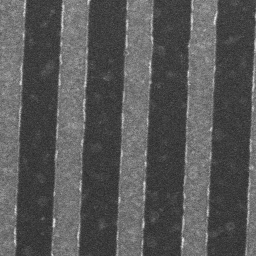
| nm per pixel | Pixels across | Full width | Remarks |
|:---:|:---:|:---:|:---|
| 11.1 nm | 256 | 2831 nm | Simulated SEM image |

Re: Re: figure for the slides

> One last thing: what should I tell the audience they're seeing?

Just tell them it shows one or a few lines or trenches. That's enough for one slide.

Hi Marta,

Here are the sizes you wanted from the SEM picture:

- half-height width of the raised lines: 446 nm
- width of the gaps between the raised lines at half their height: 0.267 micrometres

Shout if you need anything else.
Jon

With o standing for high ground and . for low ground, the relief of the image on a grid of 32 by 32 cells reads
...ooooo...ooooo...ooooo...ooooo
...ooooo...ooooo...ooooo...ooooo
...ooooo...ooooo...ooooo...ooooo
...ooooo...ooooo...ooooo...ooooo
...ooooo...ooooo...ooooo...ooooo
...ooooo...ooooo...ooooo...ooooo
...ooooo...ooooo...ooooo...ooooo
...ooooo...ooooo...ooooo...ooooo
...ooooo...ooooo...ooooo...ooooo
...oooo....ooooo...ooooo...ooooo
...oooo....ooooo...ooooo...ooooo
...oooo....ooooo...ooooo...ooooo
...oooo....ooooo...ooooo...ooooo
..ooooo...ooooo....ooooo..oooooo
..ooooo...oooooo..oooooo..oooooo
..ooooo...ooooo...ooooo...oooooo
..ooooo...ooooo...ooooo...oooooo
..ooooo...ooooo...ooooo...ooooo.
..ooooo...ooooo...ooooo...ooooo.
..ooooo...ooooo...ooooo...ooooo.
..ooooo...ooooo...ooooo...ooooo.
..ooooo...ooooo...ooooo...ooooo.
..ooooo...ooooo...ooooo...ooooo.
..ooooo...ooooo...ooooo...ooooo.
..ooooo...ooooo...ooooo...ooooo.
..ooooo...ooooo...ooooo...ooooo.
..ooooo...ooooo...ooooo...ooooo.
..ooooo...ooooo...ooooo...ooooo.
..ooooo...ooooo...ooooo...ooooo.
..ooooo...ooooo...ooooo...ooooo.
..ooooo...ooooo...ooooo...ooooo.
..ooooo...ooooo...ooooo...ooooo.